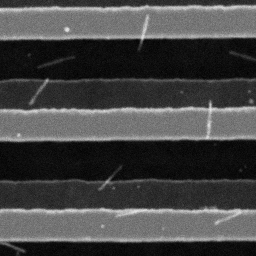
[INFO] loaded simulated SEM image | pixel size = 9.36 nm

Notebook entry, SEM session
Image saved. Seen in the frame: lines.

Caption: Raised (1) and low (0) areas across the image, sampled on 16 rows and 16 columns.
1111111111111111
1111111111111111
1000000000000000
0000000000000000
0000000000000000
1111111111111111
1111111111111111
1111111111111111
1111111111111111
0000000000000000
0000000000000000
1111111111111111
1111111111111111
1111111111111111
1111111111111111
0000000000000000